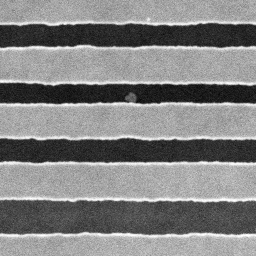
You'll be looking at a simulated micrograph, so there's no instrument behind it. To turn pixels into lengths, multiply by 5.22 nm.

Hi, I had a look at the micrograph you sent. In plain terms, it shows lines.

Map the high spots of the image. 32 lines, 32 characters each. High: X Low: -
XXXXXXXXXXXXXXXXXXXXXXXXXXXXXXXX
XXXXXXXXXXXXXXXXXXXXXXXXXXXXXXXX
XXXXXXXXXXXXXXXXXXXXXXXXXXXXXXXX
--------------------------------
--------------------------------
--------------------------------
XXXXXXXXXXXXXXXXXXXXXXXXXXXXXXXX
XXXXXXXXXXXXXXXXXXXXXXXXXXXXXXXX
XXXXXXXXXXXXXXXXXXXXXXXXXXXXXXXX
XXXXXXXXXXXXXXXXXXXXXXXXXXXXXXXX
-----XX-----------------------XX
--------------------------------
--------------------------------
XXXXXXXXXXXXXXXXXXXXXXXXXXXXXXXX
XXXXXXXXXXXXXXXXXXXXXXXXXXXXXXXX
XXXXXXXXXXXXXXXXXXXXXXXXXXXXXXXX
XXXXXXXXXXXXXXXXXXXXXXXXXXXXXXXX
------------------X-------------
--------------------------------
--------------------------------
XXXXXXXXXXXXXXXXXXXXXXXXXXXXXXXX
XXXXXXXXXXXXXXXXXXXXXXXXXXXXXXXX
XXXXXXXXXXXXXXXXXXXXXXXXXXXXXXXX
XXXXXXXXXXXXXXXXXXXXXXXXXXXXXXXX
XXXXXXXXXXXXXXXXXXXXXXXXXXXXXXXX
--------------------------------
--------------------------------
--------------------------------
--------------------------------
XXXXXXXXXXXXXXXXXXXXXXXXXXXXXXXX
XXXXXXXXXXXXXXXXXXXXXXXXXXXXXXXX
XXXXXXXXXXXXXXXXXXXXXXXXXXXXXXXX